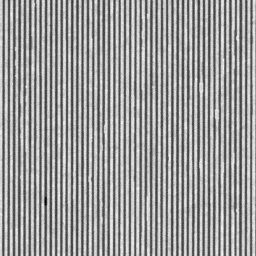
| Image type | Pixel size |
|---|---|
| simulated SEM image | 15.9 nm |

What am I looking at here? parallel lines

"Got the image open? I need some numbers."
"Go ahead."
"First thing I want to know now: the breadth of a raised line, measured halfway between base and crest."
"37.8 nm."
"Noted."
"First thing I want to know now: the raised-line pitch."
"83.8 nm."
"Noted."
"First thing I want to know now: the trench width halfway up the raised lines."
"45.7 nanometers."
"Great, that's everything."